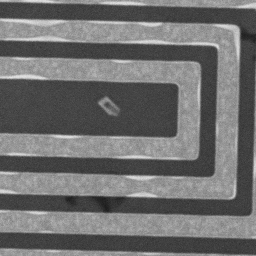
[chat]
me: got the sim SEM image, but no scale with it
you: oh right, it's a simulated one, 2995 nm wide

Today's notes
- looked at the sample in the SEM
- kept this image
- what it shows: groups of lines, slits or small figures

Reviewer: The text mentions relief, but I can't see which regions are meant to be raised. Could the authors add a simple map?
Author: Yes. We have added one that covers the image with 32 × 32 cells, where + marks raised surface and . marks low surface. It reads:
.................+++++++++++++++
................................
................................
+++++++++++++++++++++++++++++...
++++++++++++++++++++++++++++++..
..........................++++..
...........................+++..
++++++++++++++.............+++..
+++++++++++++++++++++++++..+++..
+++++++++++++++++++++++++..+++..
......................+++..+++..
......................+++..+++..
.............+........+++..+++..
.............+........+++..+++..
......................+++..+++..
......................+++..+++..
......................+++..+++..
+++++++++++++++++++++++++..+++..
+++++++++++++++++++++++++..+++..
........+++++++++++++++++..+++..
...........................+++..
...........................+++..
+++++++++++++++++++++++++++++...
+++++++++++++++++++++++++++++...
...................++++++++++...
................................
+++.............................
++++++++++++++++++++++++++++++++
++++++++++++++++++++++++++++++++
.......................+++++++++
................................
+++++++++++.....................